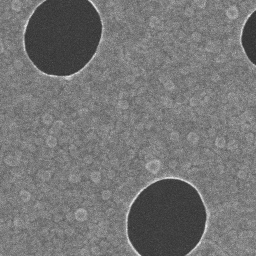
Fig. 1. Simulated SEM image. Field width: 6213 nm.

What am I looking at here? holes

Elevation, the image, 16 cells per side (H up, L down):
HHLLLLHHHHHHHHHH
HHLLLLHHHHHHHHHL
HHLLLLHHHHHHHHHL
HHLLLLHHHHHHHHHL
HHHLLHHHHHHHHHHH
HHHHHHHHHHHHHHHH
HHHHHHHHHHHHHHHH
HHHHHHHHHHHHHHHH
HHHHHHHHHHHHHHHH
HHHHHHHHHHHHHHHH
HHHHHHHHHHHHHHHH
HHHHHHHHHHLLHHHH
HHHHHHHHLLLLLHHH
HHHHHHHHLLLLLHHH
HHHHHHHHLLLLLHHH
HHHHHHHHLLLLHHHH